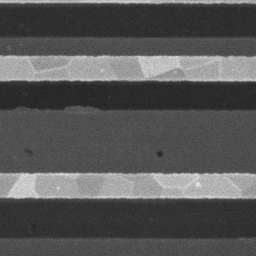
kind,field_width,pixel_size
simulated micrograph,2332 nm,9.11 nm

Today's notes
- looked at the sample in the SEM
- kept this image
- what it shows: lines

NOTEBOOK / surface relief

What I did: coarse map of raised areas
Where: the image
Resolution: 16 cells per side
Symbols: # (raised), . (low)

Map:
................
................
################
################
################
................
................
################
################
################
################
################
................
................
................
################